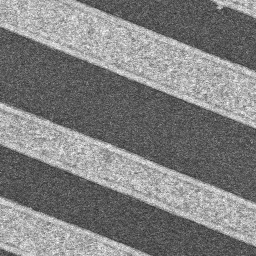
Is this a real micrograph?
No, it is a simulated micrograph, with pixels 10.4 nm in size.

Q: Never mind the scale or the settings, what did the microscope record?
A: one or a few lines or trenches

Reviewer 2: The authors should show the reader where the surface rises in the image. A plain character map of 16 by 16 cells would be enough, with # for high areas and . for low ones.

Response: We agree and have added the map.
#####..........#
########........
...#######......
.....########...
........#######.
..........######
.............###
##.............#
#####...........
..#####.........
....######......
.......#####....
.........######.
###.........####
#####.........##
.#######........